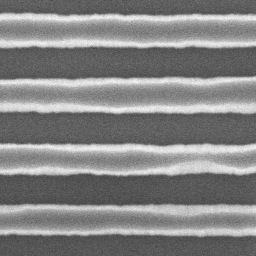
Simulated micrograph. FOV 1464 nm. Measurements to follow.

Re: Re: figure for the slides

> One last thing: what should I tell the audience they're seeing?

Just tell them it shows lines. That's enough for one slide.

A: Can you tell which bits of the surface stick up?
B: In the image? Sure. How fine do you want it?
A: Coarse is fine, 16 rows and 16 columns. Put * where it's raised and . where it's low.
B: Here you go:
................
****************
****************
................
................
****************
****************
................
................
****************
****************
................
................
****************
****************
................